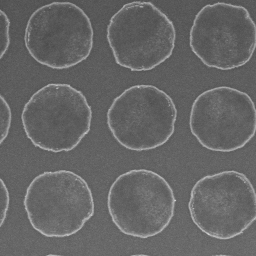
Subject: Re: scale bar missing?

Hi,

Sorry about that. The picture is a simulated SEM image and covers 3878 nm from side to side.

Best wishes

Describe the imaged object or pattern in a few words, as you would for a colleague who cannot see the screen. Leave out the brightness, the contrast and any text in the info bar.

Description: raised bodies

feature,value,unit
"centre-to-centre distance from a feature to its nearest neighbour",1240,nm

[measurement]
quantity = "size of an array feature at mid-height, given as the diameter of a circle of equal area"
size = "1000 nanometers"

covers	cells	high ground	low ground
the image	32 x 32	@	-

-------@@-------@@---------@----
-----@@@@@-----@@@@@-----@@@@@@-
@---@@@@@@@---@@@@@@@---@@@@@@@-
@--@@@@@@@@---@@@@@@@@--@@@@@@@@
@--@@@@@@@@---@@@@@@@@--@@@@@@@@
@--@@@@@@@@---@@@@@@@@--@@@@@@@@
----@@@@@@@---@@@@@@@---@@@@@@@-
-----@@@@@-----@@@@@-----@@@@@@-
----------------@@@--------@@---
--------------------------------
--------------------------------
-----@@@@@------@@@@------@@@@--
----@@@@@@@----@@@@@@----@@@@@@-
@--@@@@@@@@---@@@@@@@@--@@@@@@@@
@--@@@@@@@@---@@@@@@@@--@@@@@@@@
@--@@@@@@@@---@@@@@@@@--@@@@@@@@
@--@@@@@@@@---@@@@@@@@--@@@@@@@@
----@@@@@@-----@@@@@@----@@@@@@-
-----@@@@-------@@@-------@@@---
--------------------------------
--------------------------------
----------------@@@-------------
----@@@@@@-----@@@@@-----@@@@@@-
@---@@@@@@@---@@@@@@@---@@@@@@@-
@--@@@@@@@@---@@@@@@@@--@@@@@@@@
@--@@@@@@@@@--@@@@@@@@--@@@@@@@@
@--@@@@@@@@@--@@@@@@@---@@@@@@@@
----@@@@@@@---@@@@@@@---@@@@@@@@
----@@@@@@-----@@@@@-----@@@@@@-
---------------------------@@---
--------------------------------
--------------------------------